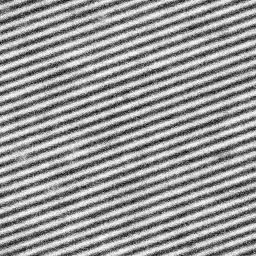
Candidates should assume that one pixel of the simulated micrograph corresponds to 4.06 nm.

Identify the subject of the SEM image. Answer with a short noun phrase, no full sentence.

parallel lines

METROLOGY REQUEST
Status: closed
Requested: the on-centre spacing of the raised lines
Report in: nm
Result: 39.1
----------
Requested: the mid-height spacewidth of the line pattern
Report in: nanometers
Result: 28.8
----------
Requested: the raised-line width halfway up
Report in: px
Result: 2.59